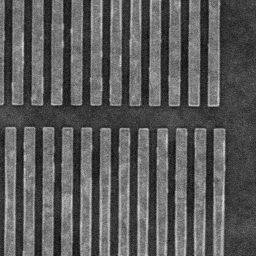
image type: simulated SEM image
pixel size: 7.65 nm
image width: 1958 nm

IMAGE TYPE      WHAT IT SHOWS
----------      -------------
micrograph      groups of lines, slits or small figures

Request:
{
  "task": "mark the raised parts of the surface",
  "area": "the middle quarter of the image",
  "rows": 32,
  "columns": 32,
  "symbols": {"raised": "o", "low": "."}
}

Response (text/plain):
..oo...oo...oo...oo...oo..ooo..o
..oo...oo...oo...oo...oo..ooo..o
..oo...oo...oo...oo...oo..ooo..o
..oo...oo...oo..ooo...oo..ooo..o
..oo...oo...oo..ooo...oo..ooo..o
..oo...oo...oo..ooo...oo..ooo..o
..oo...oo...oo..ooo...oo..ooo..o
..oo...oo...oo..ooo...oo..ooo..o
..oo...oo...oo..ooo...oo..ooo..o
..oo...oo...oo..ooo...oo..ooo..o
................................
................................
................................
................................
................................
................................
oo..ooo..oo...oo...oo...oo..ooo.
oo..ooo..oo...oo...oo..ooo..ooo.
oo..ooo..oo...oo...oo..ooo..ooo.
oo..ooo..oo...oo...oo..ooo..ooo.
oo..ooo..oo...oo...oo..ooo..ooo.
oo..ooo..oo...oo...oo..ooo..ooo.
oo..ooo..oo...oo...oo..ooo..ooo.
oo..ooo..oo...oo...oo..ooo..ooo.
oo..ooo..oo...oo...oo..ooo..ooo.
oo..ooo..oo...oo...oo..ooo..ooo.
oo..ooo..oo...oo...oo..ooo..ooo.
oo..ooo..oo...oo...oo..ooo..ooo.
oo..ooo..oo...oo...oo..ooo..ooo.
oo..ooo..oo...oo...oo..ooo..ooo.
oo..ooo..oo...oo...oo..ooo..ooo.
oo..ooo..oo...oo...oo..ooo..oo..